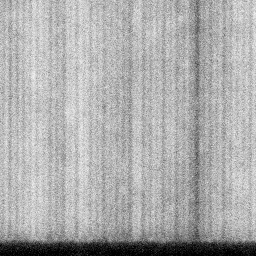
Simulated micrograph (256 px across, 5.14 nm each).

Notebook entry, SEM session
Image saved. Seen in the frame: parallel lines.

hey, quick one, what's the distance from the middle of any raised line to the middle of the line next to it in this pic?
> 34.3 nm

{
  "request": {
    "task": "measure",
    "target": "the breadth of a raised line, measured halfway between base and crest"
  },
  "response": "0.0231 µm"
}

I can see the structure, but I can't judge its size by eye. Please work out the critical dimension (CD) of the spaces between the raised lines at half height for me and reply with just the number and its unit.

9 nanometres